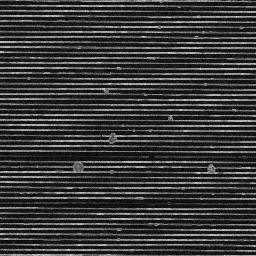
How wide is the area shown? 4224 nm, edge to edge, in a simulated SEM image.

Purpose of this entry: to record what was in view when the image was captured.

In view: parallel lines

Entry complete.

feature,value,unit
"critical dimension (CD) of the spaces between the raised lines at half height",61.9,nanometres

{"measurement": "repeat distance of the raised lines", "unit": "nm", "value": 85.7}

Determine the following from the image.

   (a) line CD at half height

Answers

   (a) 22.7 nanometres